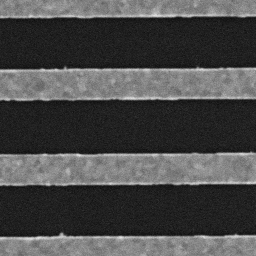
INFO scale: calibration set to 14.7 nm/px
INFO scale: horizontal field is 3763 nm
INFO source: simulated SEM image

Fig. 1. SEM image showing lines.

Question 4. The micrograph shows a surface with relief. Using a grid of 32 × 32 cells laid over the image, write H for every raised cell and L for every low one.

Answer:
HHHHHHHHHHHHHHHHHHHHHHHHHHHHHHHH
HHHHHHHHHHHHHHHHHHHHHHHHHHHHHHHH
LLLLLLLLLLLLLLLLLLLLLLLLLLLLLLLL
LLLLLLLLLLLLLLLLLLLLLLLLLLLLLLLL
LLLLLLLLLLLLLLLLLLLLLLLLLLLLLLLL
LLLLLLLLLLLLLLLLLLLLLLLLLLLLLLLL
LLLLLLLLLLLLLLLLLLLLLLLLLLLLLLLL
LLLLLLLLLLLLLLLLLLLLLLLLLLLLLLLL
LLLLLLLLLLLLLLLLLLLLLLLLLLLLLLLL
HHHHHHHHHHHHHHHHHHHHHHHHHHHHHHHH
HHHHHHHHHHHHHHHHHHHHHHHHHHHHHHHH
HHHHHHHHHHHHHHHHHHHHHHHHHHHHHHHH
LLHHLLLLLLLLLLLLLLLLLLLLLLLLLLLL
LLLLLLLLLLLLLLLLLLLLLLLLLLLLLLLL
LLLLLLLLLLLLLLLLLLLLLLLLLLLLLLLL
LLLLLLLLLLLLLLLLLLLLLLLLLLLLLLLL
LLLLLLLLLLLLLLLLLLLLLLLLLLLLLLLL
LLLLLLLLLLLLLLLLLLLLLLLLLLLLLLLL
LLLLLLLLLLLLLLLLLLLLLLLLLLLLLLLL
HHHHHHHHHHHHHHHHHHHHHHHHHHHHHHHH
HHHHHHHHHHHHHHHHHHHHHHHHHHHHHHHH
HHHHHHHHHHHHHHHHHHHHHHHHHHHHHHHH
HHHHHHHHHHHHHHHHHHHHHHHHHHHHHHHH
LLLLLLLLLLLLLLLLLLLLLLLLLLLLLLLL
LLLLLLLLLLLLLLLLLLLLLLLLLLLLLLLL
LLLLLLLLLLLLLLLLLLLLLLLLLLLLLLLL
LLLLLLLLLLLLLLLLLLLLLLLLLLLLLLLL
LLLLLLLLLLLLLLLLLLLLLLLLLLLLLLLL
LLLLLLLLLLLLLLLLLLLLLLLLLLLLLLLL
LLLLLLLLLLLLLLLLLLLLLLLLLLLLLLLL
HHHHHHHHHHHHHHHHHHHHHHHHHHHHHHHH
HHHHHHHHHHHHHHHHHHHHHHHHHHHHHHHH